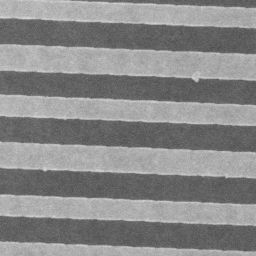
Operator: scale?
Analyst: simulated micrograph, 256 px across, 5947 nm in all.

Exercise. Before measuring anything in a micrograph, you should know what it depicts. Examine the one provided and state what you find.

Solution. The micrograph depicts lines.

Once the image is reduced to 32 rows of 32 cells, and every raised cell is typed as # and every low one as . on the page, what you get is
#################...............
################################
......##########################
................................
................................
................................
######################..........
################################
################################
...................#############
................................
................................
##############..................
################################
.###############################
...........................#####
................................
................................
################................
################################
################################
..............##################
................................
................................
##..............................
############################....
################################
...............#################
................................
................................
######..........................
###############################.